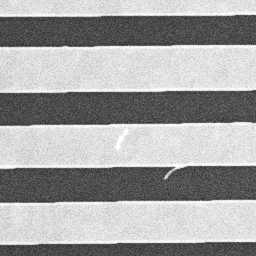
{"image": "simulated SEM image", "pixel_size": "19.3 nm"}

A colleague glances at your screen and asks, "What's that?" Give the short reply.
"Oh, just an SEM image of lines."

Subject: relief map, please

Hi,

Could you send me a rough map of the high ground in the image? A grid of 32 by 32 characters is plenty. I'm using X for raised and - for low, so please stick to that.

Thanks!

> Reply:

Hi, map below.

XXXXXXXXXXXXXXXXXXXXXXXXXXXXXXXX
XXXXXXXXXXXXXXXXXXXXXXXXXXXXXXXX
--------------------------------
--------------------------------
--------------------------------
--------------------------------
XXXXXXXXXXXXXXXXXXXXXXXXXXXXXXXX
XXXXXXXXXXXXXXXXXXXXXXXXXXXXXXXX
XXXXXXXXXXXXXXXXXXXXXXXXXXXXXXXX
XXXXXXXXXXXXXXXXXXXXXXXXXXXXXXXX
XXXXXXXXXXXXXXXXXXXXXXXXXXXXXXXX
--------------------------------
--------------------------------
--------------------------------
--------------------------------
------------------------XXXXXXXX
XXXXXXXXXXXXXXXXXXXXXXXXXXXXXXXX
XXXXXXXXXXXXXXXXXXXXXXXXXXXXXXXX
XXXXXXXXXXXXXXXXXXXXXXXXXXXXXXXX
XXXXXXXXXXXXXXXXXXXXXXXXXXXXXXXX
XXXXXXXXXXXXXXXXXXXXXXXXXXXXXXXX
--------------------------------
--------------------------------
--------------------------------
--------------------------------
XXXXXXXXXXXXXXXXXXXXXXXXXXXXXXXX
XXXXXXXXXXXXXXXXXXXXXXXXXXXXXXXX
XXXXXXXXXXXXXXXXXXXXXXXXXXXXXXXX
XXXXXXXXXXXXXXXXXXXXXXXXXXXXXXXX
XXXXXXXXXXXXXXXXXXXXXXXXXXXXXXXX
XXX-----------------------------
--------------------------------